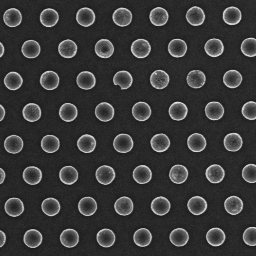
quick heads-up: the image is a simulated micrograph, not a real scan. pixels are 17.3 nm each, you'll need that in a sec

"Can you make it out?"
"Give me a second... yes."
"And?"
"a regular array of raised bodies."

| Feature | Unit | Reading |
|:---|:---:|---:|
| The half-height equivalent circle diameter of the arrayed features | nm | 313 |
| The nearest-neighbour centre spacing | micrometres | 0.628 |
